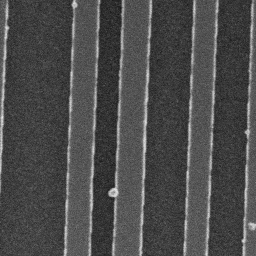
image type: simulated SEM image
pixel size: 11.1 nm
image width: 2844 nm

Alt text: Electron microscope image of lines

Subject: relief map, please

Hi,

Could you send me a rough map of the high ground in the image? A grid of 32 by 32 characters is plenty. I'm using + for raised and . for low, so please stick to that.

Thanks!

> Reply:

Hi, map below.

+........+++...++++.....+++....+
+........+++...++++.....+++....+
+........+++...++++.....+++....+
+........+++...++++.....+++....+
+........+++...++++.....+++....+
+........+++...++++.....+++....+
+........+++...++++.....+++....+
+........+++...++++.....+++....+
+........+++...++++.....+++....+
+........+++...++++.....+++....+
+........+++...++++.....+++....+
.........+++...+++......+++....+
.........+++...+++......+++....+
.........+++...+++......+++....+
.........+++...+++......+++....+
.........+++...+++......+++....+
.........+++...+++......++.....+
.........+++...+++......++.....+
.........+++...+++......++.....+
.........+++...+++......++.....+
.........+++...+++......++.....+
........++++..++++.....+++.....+
........++++..++++.....+++.....+
........++++..++++.....+++.....+
........++++..++++.....+++.....+
........++++..++++.....+++.....+
........+++...++++.....+++.....+
........+++...++++.....+++.....+
........+++...++++.....+++.....+
........+++...++++.....+++.....+
........+++...++++.....+++....++
........+++...++++.....+++....++